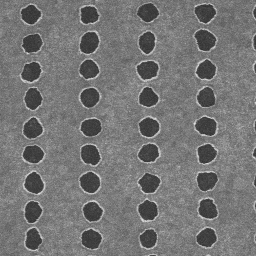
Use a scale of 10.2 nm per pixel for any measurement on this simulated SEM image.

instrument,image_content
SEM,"a regular array of holes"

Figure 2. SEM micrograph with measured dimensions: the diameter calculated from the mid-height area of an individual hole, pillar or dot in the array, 20 pixels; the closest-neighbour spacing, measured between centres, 279 nanometres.